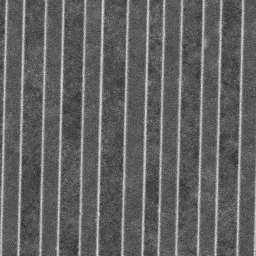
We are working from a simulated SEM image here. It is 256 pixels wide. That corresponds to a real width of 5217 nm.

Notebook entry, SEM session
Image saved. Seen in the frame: parallel lines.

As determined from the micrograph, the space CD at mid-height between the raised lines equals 433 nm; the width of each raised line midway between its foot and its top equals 369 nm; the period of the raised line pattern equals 803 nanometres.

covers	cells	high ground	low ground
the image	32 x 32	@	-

-@@---@@---@@---@@---@@--@@@--@@
-@@---@@---@@---@@---@@--@@@--@@
-@@---@@---@@---@@---@@--@@@--@@
-@@---@@---@@---@@--@@@--@@@--@@
-@@---@@---@@---@@--@@@--@@@--@@
-@@---@@---@@---@@--@@@--@@@--@@
-@@---@@---@@---@@--@@@--@@@--@@
-@@---@@---@@---@@--@@@--@@---@@
-@@---@@---@@---@@--@@@--@@---@@
-@@---@@---@@---@@--@@@--@@---@@
-@@---@@--@@@---@@--@@@--@@---@@
-@@---@@--@@@---@@--@@---@@---@@
-@@---@@--@@@---@@--@@---@@---@@
-@@--@@@--@@@---@@--@@---@@---@@
-@@--@@@--@@@---@@--@@---@@---@@
-@@--@@@--@@@---@@--@@---@@---@@
-@@--@@@--@@@---@@--@@---@@---@@
@@@--@@@--@@----@@--@@---@@---@@
@@@--@@@--@@----@@--@@---@@---@@
@@@--@@@--@@----@@--@@---@@---@@
@@@--@@@--@@----@@--@@---@@---@@
@@@--@@---@@----@@--@@---@@---@@
@@@--@@---@@----@@--@@---@@---@@
@@@--@@---@@---@@@--@@---@@---@@
@@---@@---@@---@@@--@@---@@---@@
@@---@@---@@---@@@--@@---@@---@@
@@---@@---@@---@@@--@@---@@---@@
@@---@@---@@---@@@--@@---@@---@@
@@---@@---@@---@@@--@@---@@---@@
@@---@@---@@---@@@--@@---@@---@@
@@---@@---@@---@@@--@@---@@---@@
@@---@@---@@---@@@--@@---@@---@@